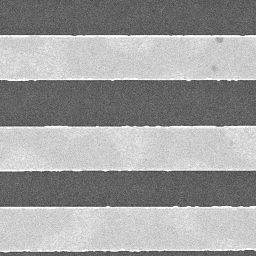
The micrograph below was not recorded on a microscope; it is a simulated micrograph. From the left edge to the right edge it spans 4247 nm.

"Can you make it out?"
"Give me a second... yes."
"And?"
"lines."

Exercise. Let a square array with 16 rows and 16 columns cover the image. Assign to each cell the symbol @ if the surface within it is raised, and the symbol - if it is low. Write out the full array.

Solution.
----------------
----------------
@@@@@@@@@@@@@@@@
@@@@@@@@@@@@@@@@
@@@@@@@@@@@@@@@@
----------------
----------------
----------------
@@@@@@@@@@@@@@@@
@@@@@@@@@@@@@@@@
@@@@@@@@@@@@@@@@
----------------
----------------
@@@@@@@@@@@@@@@@
@@@@@@@@@@@@@@@@
@@@@@@@@@@@@@@@@